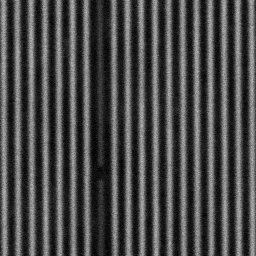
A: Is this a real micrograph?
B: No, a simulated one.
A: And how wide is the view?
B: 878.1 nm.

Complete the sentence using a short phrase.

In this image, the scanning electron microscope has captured parallel lines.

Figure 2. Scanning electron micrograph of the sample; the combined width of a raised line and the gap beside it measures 0.0473 µm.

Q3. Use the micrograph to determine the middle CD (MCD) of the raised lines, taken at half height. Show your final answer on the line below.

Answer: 13.7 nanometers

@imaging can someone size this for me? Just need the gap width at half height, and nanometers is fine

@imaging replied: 33.9